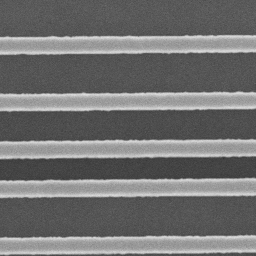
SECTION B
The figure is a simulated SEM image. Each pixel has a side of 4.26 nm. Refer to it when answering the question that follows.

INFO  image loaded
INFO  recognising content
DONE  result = lines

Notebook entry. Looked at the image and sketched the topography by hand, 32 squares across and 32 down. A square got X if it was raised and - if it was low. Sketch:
--------------------------------
--------------------------------
--------------------------------
--------------------------------
----------------X------XXXXXXXXX
XXXXXXXXXXXXXXXXXXXXXXXXXXXXXXXX
XXXXXXXXXXXXXXXXXXXXXXXXXXXXXXXX
--------------------------------
--------------------------------
--------------------------------
--------------------------------
--------------------------------
XXXXXXXXXXXXXXXXXXXXXXXXXXXXXXXX
XXXXXXXXXXXXXXXXXXXXXXXXXXXXXXXX
--------------------------------
--------------------------------
--------------------------------
---------------------------XXX-X
XXXXXXXXXXXXXXXXXXXXXXXXXXXXXXXX
XXXXXXXXXXXXXXXXXXXXXXXXXXXXXXXX
--------------------------------
--------------------------------
-----XX-XXXXXXXXXXXXXXXXXXXXXXXX
XXXXXXXXXXXXXXXXXXXXXXXXXXXXXXXX
XXXXXXXXXXXXXXXXXXX-------------
--------------------------------
--------------------------------
--------------------------------
--------------------------------
------------------------------XX
XXXXXXXXXXXXXXXXXXXXXXXXXXXXXXXX
XXXXXXXXXXXXXXXXXXXXXXXXXXXXX-X-